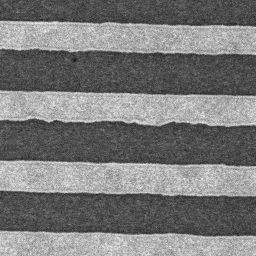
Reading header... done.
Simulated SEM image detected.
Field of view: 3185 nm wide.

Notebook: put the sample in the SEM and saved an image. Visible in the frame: one or a few lines or trenches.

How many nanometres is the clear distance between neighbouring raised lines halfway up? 525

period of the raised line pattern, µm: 0.875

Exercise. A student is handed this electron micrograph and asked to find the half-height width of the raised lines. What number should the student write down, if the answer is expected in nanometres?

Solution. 350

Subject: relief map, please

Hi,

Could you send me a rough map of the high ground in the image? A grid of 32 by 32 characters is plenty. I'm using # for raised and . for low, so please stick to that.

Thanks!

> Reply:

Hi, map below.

................................
................................
................................
################################
################################
################################
....................############
................................
................................
................................
................................
##..............................
################################
################################
################################
...................#......######
................................
................................
................................
................................
###########...#.................
################################
################################
################################
................................
................................
................................
................................
................................
########################........
################################
################################